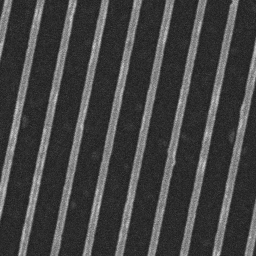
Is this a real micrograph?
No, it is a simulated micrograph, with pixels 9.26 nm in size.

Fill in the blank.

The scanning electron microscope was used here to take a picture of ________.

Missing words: parallel lines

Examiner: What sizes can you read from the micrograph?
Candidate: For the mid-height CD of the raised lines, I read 66.9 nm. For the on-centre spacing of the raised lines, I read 294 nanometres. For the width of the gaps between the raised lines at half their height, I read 227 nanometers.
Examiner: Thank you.